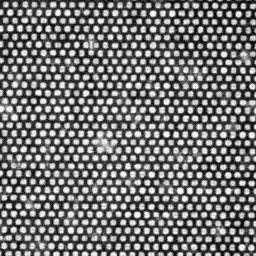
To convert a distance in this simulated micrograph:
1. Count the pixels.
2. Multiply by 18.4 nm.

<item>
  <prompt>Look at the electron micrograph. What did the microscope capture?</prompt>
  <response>a regular array of raised bodies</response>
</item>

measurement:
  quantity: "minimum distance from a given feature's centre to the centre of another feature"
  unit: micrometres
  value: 0.166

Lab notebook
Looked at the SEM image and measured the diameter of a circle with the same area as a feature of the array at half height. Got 83.3 nanometres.